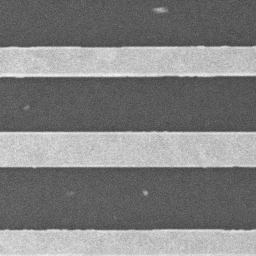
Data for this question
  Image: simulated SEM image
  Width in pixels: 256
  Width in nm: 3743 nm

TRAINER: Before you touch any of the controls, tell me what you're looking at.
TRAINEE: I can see lines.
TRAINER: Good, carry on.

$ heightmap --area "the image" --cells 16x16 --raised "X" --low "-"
----------------
----------------
----------------
XXXXXXXXXXXXXXXX
XXXXXXXXXXXXXXXX
----------------
----------------
----------------
XXXXXXXXXXXXXXXX
XXXXXXXXXXXXXXXX
----------------
----------------
----------------
----------------
XXXXXXXXXXXXXXXX
XXXXXXXXXXXXXXXX